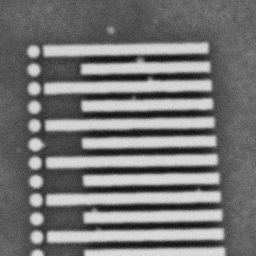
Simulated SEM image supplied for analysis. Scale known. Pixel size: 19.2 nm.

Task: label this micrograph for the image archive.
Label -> groups of lines, slits or small figures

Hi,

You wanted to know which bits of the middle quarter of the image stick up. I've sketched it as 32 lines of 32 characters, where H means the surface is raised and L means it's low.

LLLLHHHHHHHHHHHHHHHHHHHHHHHHHHHH
LLLLHHHHHHHHHHHHHHHHHHHHHHHHHHHH
LLLLLHLLLHHLLLLLLLLLLLLLLLLLLLLL
LLLLLLLLLLLLLLLLLLLLLLLLLLLLLLLL
LLLLLLLLLLLLLLLLLLLLLHHHHHHHHHHH
HHHHHHHHHHHHHHHHHHHHHHHHHHHHHHHH
HHHHHHHHHHHHHHHHHHHHHHHHHHHHHHHH
LLLLLLLLLLLLLLLLLLLLLLLLLLLLLLLL
LLLLLLLLLLLLLLLLLLLLLLLLLLLLLLLL
LLLLLHHHHHHHHHHHHHHHHHHHHHHHHHHH
LLLLLHHHHHHHHHHHHHHHHHHHHHHHHHHH
LLLLLHHHHHHHHHHHHHHHHHLLLLLLLLLL
LLLLLLLLLLLLLLLLLLLLLLLLLLLLLLLL
LLLLLLLLLLLLLLLLLLLLLLLLLLLLLLLL
HHHHHHHHHHHHHHHHHHHHHHHHHHHHHHHH
HHHHHHHHHHHHHHHHHHHHHHHHHHHHHHHH
HHHHLLLLLLLLLLLLLLLLLLLLLLLLLLLL
LLLLLLLLLLLLLLLLLLLLLLLLLLLLLLLL
LLLLLLLLLLLLLLLLLLLHHHHHHHHHHHHH
LLLLLHHHHHHHHHHHHHHHHHHHHHHHHHHH
LLLLLHHHHHHHHHHHHHHHHHHHHHHHHHHH
LLLLLLLLLLLLLLLLLLLLLLLLLLLLLLLL
LLLLLLLLLLLLLLLLLLLLLLLLLLLLLLLL
LLHHHHHHHHHHHHHHHHHHHHHHHHHHHHHH
HHHHHHHHHHHHHHHHHHHHHHHHHHHHHHHH
HHHHHHHHHHHHHHHHHHHHHLLLLLLLLLLL
LLLLLLLLLLLLLLLLLLLLLLLLLLLLLLLL
LLLLLLLLLLLLLLLLLLLLLLLLLLLLLLLL
LLLLLHHHHHHHHHHHHHHHHHHHHHHHHHHH
LLLLLHHHHHHHHHHHHHHHHHHHHHHHHHHH
LLLLLLLLLLLLLLLLLLLLLLLLLLLLLLLL
LLLLLLLLLLLLLLLLLLLLLLLLLLLLLLLL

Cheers